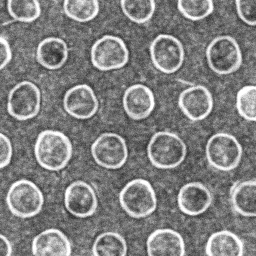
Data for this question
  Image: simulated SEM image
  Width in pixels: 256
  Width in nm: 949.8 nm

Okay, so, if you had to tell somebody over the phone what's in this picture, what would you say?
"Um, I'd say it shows a regular array of raised bodies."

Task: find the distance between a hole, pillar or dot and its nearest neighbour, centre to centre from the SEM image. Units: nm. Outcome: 207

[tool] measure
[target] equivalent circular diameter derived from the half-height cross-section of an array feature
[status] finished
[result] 124 nanometres